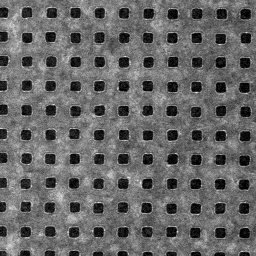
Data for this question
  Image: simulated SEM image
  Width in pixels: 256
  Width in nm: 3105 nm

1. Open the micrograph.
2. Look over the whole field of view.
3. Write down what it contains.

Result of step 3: a regular array of raised bodies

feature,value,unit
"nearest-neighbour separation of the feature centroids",289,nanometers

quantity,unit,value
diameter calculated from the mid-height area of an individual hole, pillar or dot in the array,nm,150